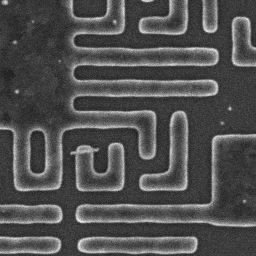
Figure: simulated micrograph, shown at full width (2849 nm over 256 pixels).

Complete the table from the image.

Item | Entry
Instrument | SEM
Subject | wiring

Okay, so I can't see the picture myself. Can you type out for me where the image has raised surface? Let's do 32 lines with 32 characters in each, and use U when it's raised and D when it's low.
UUUUUUUUUDDDDUUDDDDDDUUDDUUDDDDD
UUUUUUUUUDDDDUUUDDDDDUUDDUUDDDDD
UUUUUUUUUUUUUUUUDDUUUUUDDUUDDUUD
UUUUUUUUUUUUUUUDDUUUUUUDDUUDDUUD
UUUUUUUUUUDDDDDDDDDDDDDDDDDDDUUD
UUUUUUUUUDDDDDDDDDDDDDDDDDDDDUUD
UUUUUUUUUUUUUUUUUUUUUUUUUUUDDUUU
UUUUUUUUUUUUUUUUUUUUUUUUUUUDDUUU
UUUUUUUUUDDDDDDDDDDDDDDDDDDDDDDD
UUUUUUUUUDDDDDDDDDDDDDDDDDDDDDDD
UUUUUUUUUUUUUUUUUUUUUUUUUUUDDDDD
UUUUUUUUUUUUUUUUUUUUUUUUUUUDDDDD
UUUUUUUUUDDDDDDDDDDDDDDDDDDDDDDD
UUUUUUUUUDDDDDDDDDDDDDDDDDDDDDDD
UUUUUUUUUUUUUUUUUUUDDDUDDDDDDDDD
UUUUUUUUUUUUUUUUUUUDDUUDDDDDDDDD
DDUUDUUUDDDDDDDDDUUDDUUDDDDDDDDD
DDUUDDUUDDDDDDDDDUUDDUUDDDDUUUUU
DDUUDDUUDDUDDDUDDUUDDUUDDDDUUUUU
DDUUDDUUDUUUDDUDDDUDDUUDDDDUUUUU
DDUUDDUUDDUUDDUDDDDDDUUDDDDUUUUU
DDUUDUUUDDUUDUUDDDDDDUUDDDDUUUUU
DDUUUUUUDDUUUUUDDDUUUUUDDDDUUUUU
DDUUUUUDDDUUUUUDDDUUUUUDDDDUUUUU
DDDDDDDDDDDDDDDDDDDDDDDDDDDUUUUU
DDDDDDDDDDDDDDDDDDDDDDDDDDUUUUUU
UUUUUUUUDDUUUUUUUUUUUUUUUUUUUUUU
UUUUUUUUDDUUUUUUUUUUUUUUUUUUUUUU
DDDDDDDDDDDDDDDDDDDDDDDDDDDDDDDD
DDDDDDDDDDDDDDDDDDDDDDDDDDDDDDDD
UUUUUUUUDDUUUUUUUUUUUUUUUDDDDDDD
UUUUUUUDDDUUUUUUUUUUUUUUDDDDDDDD